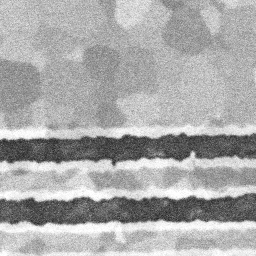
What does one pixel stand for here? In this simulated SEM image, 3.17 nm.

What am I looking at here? one or a few lines or trenches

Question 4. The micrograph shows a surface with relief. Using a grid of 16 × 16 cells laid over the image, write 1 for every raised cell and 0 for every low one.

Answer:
1111111111111111
1111111111111111
1111111111111111
1111111111111111
1111111111111111
1111111111111111
1111111111111111
1111111111111111
0000000000000000
0000000000000000
1111111111111111
1111111111111111
0000000000000000
0000000000000000
1111111111111111
1111111111111111